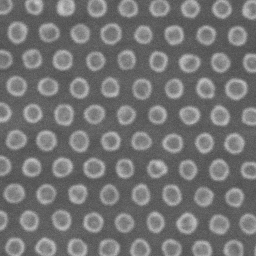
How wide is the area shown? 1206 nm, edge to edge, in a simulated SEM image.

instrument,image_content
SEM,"a regular array of raised bodies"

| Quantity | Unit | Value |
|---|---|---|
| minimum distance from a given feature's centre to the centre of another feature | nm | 143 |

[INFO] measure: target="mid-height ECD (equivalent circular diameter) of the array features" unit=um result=0.0825